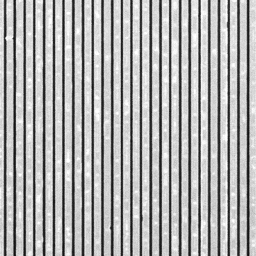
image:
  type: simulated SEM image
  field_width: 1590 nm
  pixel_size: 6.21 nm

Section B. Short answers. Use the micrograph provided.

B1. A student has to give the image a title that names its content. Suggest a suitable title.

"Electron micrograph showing parallel lines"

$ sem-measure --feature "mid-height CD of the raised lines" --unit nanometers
41.1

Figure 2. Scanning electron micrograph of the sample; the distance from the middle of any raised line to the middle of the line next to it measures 60.4 nanometres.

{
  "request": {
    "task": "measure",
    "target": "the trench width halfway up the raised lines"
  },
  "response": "0.0178 µm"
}